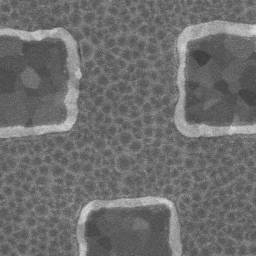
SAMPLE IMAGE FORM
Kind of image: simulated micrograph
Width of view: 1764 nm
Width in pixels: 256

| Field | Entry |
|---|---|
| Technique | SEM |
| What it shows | raised bodies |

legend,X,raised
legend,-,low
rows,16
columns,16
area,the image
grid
----------------
----------------
XXXX--------XXXX
XXXXX------XXXXX
XXXXX------XXXXX
XXXXX------XXXXX
XXXX-------XXXXX
XXXX-------XXXXX
----------------
----------------
----------------
----------------
---------X------
-----XXXXXX-----
-----XXXXXX-----
-----XXXXXX-----